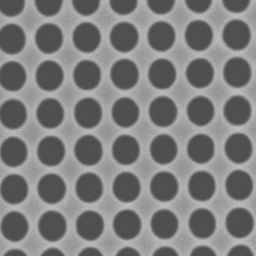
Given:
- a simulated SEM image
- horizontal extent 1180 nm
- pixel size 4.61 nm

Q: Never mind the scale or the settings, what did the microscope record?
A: a regular array of holes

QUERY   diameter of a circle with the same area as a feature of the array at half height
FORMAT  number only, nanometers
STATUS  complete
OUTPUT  134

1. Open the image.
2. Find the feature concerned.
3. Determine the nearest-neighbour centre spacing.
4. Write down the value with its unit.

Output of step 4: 172 nm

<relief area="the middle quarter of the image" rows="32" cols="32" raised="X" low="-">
XXX------XXX------XXXX-----XXXX-
XX-------XXX------XXX-------XXX-
XX-------XXX-------XX-------XX--
XX-------XXX-------XX-------XXX-
XXX------XXX------XXXX-----XXXX-
XXX-----XXXXX-----XXXX-----XXXXX
XXXXX--XXXXXXXX-XXXXXXXXXXXXXXXX
XXXXXXXXXXXXXXXXXXXXXXXXXXXXXXXX
XXXXX--XXXXXXXX--XXXXXX---XXXXXX
XXXX----XXXXX-----XXXX-----XXXX-
XXX------XXX------XXX-------XXX-
XXX-------XX-------XX-------XXX-
XX--------XX-------XX-------XXX-
XXX------XXX-------XX-------XXX-
XXX------XXXX-----XXXX-----XXXXX
XXXX----XXXXXX---XXXXXX---XXXXXX
XXXXXXXXXXXXXXXXXXXXXXXXXXXXXXXX
XXXXXXXXXXXXXXXXXXXXXXXX-XXXXXXX
XXXX----XXXXX-----XXXXX----XXXXX
XXX------XXXX-----XXXX------XXX-
XXX------XXX-------XXX------XXX-
XX--------XX-------XX--------XX-
XXX-------XX-------XXX------XXX-
XXX------XXX-------XXX------XXXX
XXXX-----XXXX-----XXXXX----XXXXX
XXXXXX-XXXXXXXXXXXXXXXXXXXXXXXXX
XXXXXXXXXXXXXXXXXXXXXXXXXXXXXXXX
XXXXX---XXXXXX---XXXXXX----XXXXX
XXXX-----XXXX-----XXXX------XXX-
XXX------XXX-------XXX------XXX-
XXX-------XX-------XXX-------XX-
-XX-------XX-------XXX-------XX-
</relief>